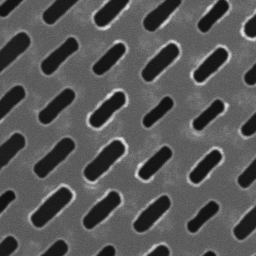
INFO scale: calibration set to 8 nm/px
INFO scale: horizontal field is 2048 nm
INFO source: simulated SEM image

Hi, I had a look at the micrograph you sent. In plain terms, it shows a regular array of holes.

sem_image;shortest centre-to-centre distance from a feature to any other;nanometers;399